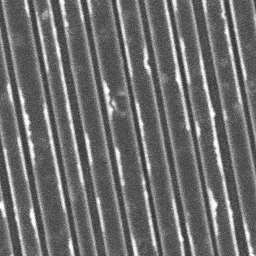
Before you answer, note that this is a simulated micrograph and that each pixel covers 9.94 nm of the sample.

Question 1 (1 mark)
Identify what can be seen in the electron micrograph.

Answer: parallel lines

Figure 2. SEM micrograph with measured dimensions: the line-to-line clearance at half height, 66 nanometres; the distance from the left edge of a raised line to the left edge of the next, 0.276 µm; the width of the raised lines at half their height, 20 px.